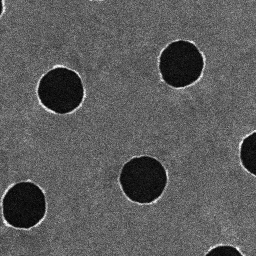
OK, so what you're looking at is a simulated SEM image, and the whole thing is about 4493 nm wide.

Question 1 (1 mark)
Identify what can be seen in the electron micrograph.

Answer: holes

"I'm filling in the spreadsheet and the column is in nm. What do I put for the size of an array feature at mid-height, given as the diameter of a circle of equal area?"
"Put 797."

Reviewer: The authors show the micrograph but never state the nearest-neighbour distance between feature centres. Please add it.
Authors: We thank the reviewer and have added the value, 121 px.